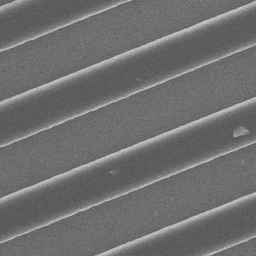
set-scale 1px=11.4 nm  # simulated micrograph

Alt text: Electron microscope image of lines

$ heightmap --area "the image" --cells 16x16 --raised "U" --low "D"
UUUUUUUDDDDDDDDU
UUUUDDDDDDDDUUUU
UUDDDDDDDDUUUUUU
DDDDDDDUUUUUUUDD
DDDDDUUUUUUUDDDD
DDUUUUUUUDDDDDDD
UUUUUUUDDDDDDDDU
UUUUDDDDDDDDUUUU
UUDDDDDDDDUUUUUU
DDDDDDDUUUUUUUDD
DDDDDUUUUUUUDDDD
DDUUUUUUUDDDDDDD
UUUUUUUDDDDDDDDU
UUUUDDDDDDDDUUUU
UUDDDDDDDDUUUUUU
DDDDDDDUUUUUUUDD